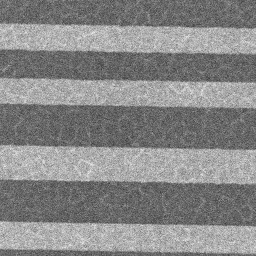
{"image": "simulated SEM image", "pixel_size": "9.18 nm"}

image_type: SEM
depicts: one or a few lines or trenches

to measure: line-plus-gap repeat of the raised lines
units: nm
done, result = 608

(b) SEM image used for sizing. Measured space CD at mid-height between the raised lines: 391 nm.